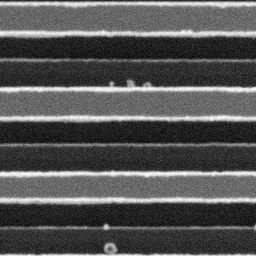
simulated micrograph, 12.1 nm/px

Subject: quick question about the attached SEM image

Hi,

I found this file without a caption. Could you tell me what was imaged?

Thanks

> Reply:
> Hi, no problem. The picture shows lines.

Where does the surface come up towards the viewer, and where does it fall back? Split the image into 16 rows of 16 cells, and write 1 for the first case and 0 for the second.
1111111111111111
1111111111111111
0000000000000000
0000000000000000
0000000000000000
1111111111111111
1111111111111111
0000000000000000
0000000000000000
0000000000000000
0000000000000000
1111111111111111
1111111111111111
0000000000000000
0000000000000000
0000000000000000